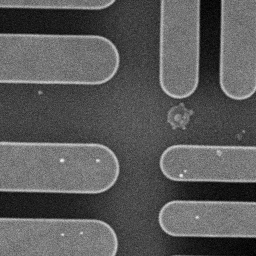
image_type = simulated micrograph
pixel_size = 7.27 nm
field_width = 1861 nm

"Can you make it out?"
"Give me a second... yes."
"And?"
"groups of lines, slits or small figures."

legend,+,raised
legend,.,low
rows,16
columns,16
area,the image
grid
...+++....++..++
..........++..++
+++++++...++..++
+++++++...++..++
+++++++...++..++
..........++..++
................
................
................
+++++++...++++++
+++++++...++++++
+++++++.........
................
..........++++++
+++++++...++++++
+++++++.........